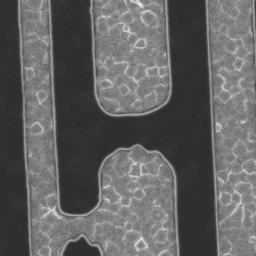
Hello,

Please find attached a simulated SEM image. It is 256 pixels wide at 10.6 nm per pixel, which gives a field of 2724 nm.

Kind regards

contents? one or a few lines or trenches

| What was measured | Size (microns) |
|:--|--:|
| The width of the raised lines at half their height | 0.444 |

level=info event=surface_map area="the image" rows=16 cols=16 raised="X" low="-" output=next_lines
X--XXX----XXX---
X--XXX----XXX---
X--XXX----XXX---
X--XXX-----XX---
X--XXX-----XX---
X--XXX-----XX---
XX-XXX----XXX---
XX-XXXXXXXXXX---
XX-XXXXXXXXXX---
XX-XXXX--XXXX---
XX--XX-----XX---
XX--XX-----XX---
XX--XX-----XXX--
XX---------XXX--
XX---------XXX--
XX--XX-----XXX--